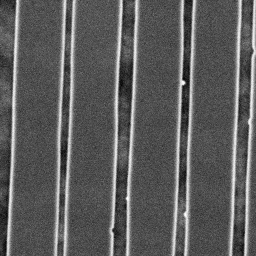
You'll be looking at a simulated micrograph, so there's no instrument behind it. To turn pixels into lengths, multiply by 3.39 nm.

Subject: parallel lines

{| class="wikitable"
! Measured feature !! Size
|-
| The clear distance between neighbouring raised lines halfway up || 39.3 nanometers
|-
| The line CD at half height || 164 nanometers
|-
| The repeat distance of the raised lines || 199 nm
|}